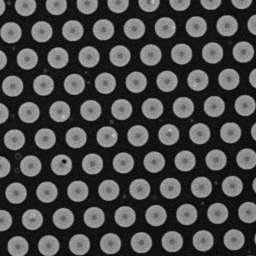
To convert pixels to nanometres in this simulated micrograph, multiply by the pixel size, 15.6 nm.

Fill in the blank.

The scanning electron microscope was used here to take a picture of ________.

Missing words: an array of small figures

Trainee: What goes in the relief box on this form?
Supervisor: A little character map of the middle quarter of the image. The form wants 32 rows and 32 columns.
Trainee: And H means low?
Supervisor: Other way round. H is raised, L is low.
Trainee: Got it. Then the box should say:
LLLLLHHHLLLLLHHLLLLLLLLLLLLLLLLL
LLLLLLLLLLLLLLLLLLLLLLLLLLLLLLLL
LLLLLLLLLHHHLLLLLHHHLLLLHHHHLLLH
LHHHHLLLHHHHHLLLHHHHLLLHHHHHLLLH
HHHHHLLLHHHHHLLHHHHHHLLHHHHHLLLH
HHHHHLLLHHHHHLLLHHHHLLLHHHHHLLLH
HHHHHLLLHHHHLLLLHHHHLLLLHHHLLLLL
LLHHLLLLLLLLLLLLLLLLLLLLLLLLLLLL
LLLLLLLLLLLLLLLLLLLLLLLLLLLLLHHL
LLLLLHHHLLLLLHHHLLLLHHHHLLLLHHHH
HLLLHHHHHLLLHHHHHLLLHHHHHLLHHHHH
HLLLHHHHHLLLHHHHHLLLHHHHHLLHHHHH
HLLLHHHHHLLLHHHHHLLLHHHHLLLLHHHH
HLLLLHHHHLLLLHHHLLLLLHHLLLLLLLLL
LLLLLLLLLLLLLLLLLLLLLLLLLLLLLLLL
LLLLLLLLLLLLLLLLLLHLLLLLLHHHLLLL
LHHHHLLLLHHHHLLLHHHHHLLLHHHHHLLH
LHHHHLLLHHHHHLLLHHHHHLLLHHHHHLLH
HHHHHHLLHHHHHLLLHHHHHLLLHHHHHLLL
LHHHHLLLLHHHHLLLHHHHHLLLHHHHLLLL
LHHHHLLLLHHHLLLLLLLLLLLLLLLLLLLL
LLLLLLLLLLLLLLLLLLLLLLLLLLLLLLLL
LLLLLLHHLLLLLHHHLLLLLHHHLLLLHHHH
HLLLLHHHHLLLLHHHHLLLHHHHHLLLHHHH
HHLLLHHHHHLLHHHHHLLLHHHHHLLLHHHH
HHLLLHHHHHLLHHHHHLLLHHHHHLLLHHHH
HHLLLHHHHLLLLHHHHLLLLHHHLLLLLHHL
HLLLLLLLLLLLLLLLLLLLLLLLLLLLLLLL
LLLLLLLLLLLLLLLLLLLLLLLLLLLLLLLL
LLHHHLLLLLHHHLLLLHHHHLLLHHHHHLLL
LHHHHHLLLHHHHHLLLHHHHLLLHHHHHLLL
LHHHHHLLLHHHHHLLHHHHHLLLHHHHHLLL